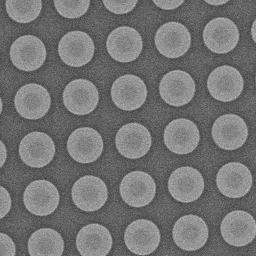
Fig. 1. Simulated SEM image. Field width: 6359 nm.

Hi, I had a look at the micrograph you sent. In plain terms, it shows an array of small figures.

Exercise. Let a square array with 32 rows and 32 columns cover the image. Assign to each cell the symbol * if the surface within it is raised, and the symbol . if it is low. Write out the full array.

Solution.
.****..****..****..****...**....
.****..****...**................
..**.......................**...
...............*....***...****..
...*....***...***..*****.*****..
..***..*****.*****.*****..****..
.*****.*****..****..***....*....
.*****..***....**...............
..***......................**...
...............**....***..****..
.........***..****..****..****..
..****..****..****..****..****..
..****..****..****...***...**...
..****..****...**...............
...**.......................**..
................*....***...****.
.........***...****..****..****.
...***...****..****..****..****.
*.*****.*****..****..***....**..
*..****..***....**..............
...***......................**..
.................*....***..****.
..........***..****..****..****.
...****..****..****..****..****.
*..****..****..****...***...**..
*..****..****...**..............
*...**.......................**.
.................*....***...****
..........***...****..****..****
*...***...****..****..****..****
**..****..****..****..***....**.
**..****..***....**.............